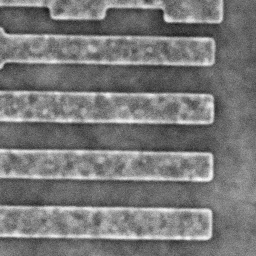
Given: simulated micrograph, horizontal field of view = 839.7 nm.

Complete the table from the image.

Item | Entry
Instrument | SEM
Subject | wiring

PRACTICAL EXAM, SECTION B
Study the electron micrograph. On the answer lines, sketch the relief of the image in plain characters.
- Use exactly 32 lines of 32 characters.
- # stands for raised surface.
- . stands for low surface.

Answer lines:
############################....
......#######.......########....
.....................#######....
................................
########........................
###########################.....
###########################.....
###########################.....
................................
................................
................................
.##.............................
###########################.....
###########################.....
###########################.....
................................
................................
................................
................................
##########################......
##########################......
##########################......
.......................###......
................................
................................
................................
##########################......
##########################......
##########################......
..########################......
................................
................................